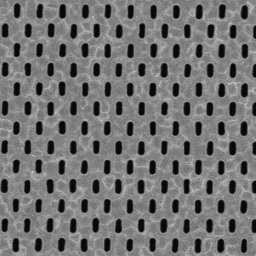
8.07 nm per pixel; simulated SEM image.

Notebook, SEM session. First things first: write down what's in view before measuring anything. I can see a regular array of holes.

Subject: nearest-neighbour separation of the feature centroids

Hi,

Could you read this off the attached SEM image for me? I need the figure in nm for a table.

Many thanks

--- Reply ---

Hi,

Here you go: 178